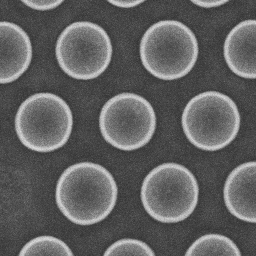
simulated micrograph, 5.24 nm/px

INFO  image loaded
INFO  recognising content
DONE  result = raised bodies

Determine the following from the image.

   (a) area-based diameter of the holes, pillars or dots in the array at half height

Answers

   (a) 0.287 microns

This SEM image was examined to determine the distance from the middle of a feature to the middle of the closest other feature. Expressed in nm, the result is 431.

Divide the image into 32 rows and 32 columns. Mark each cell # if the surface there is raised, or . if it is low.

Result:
....###........##........##.....
................................
................................
##.......###.......####.......##
###.....#####.....######.....###
####...#######....######....####
####...#######....######....####
####....######....######....####
###.....#####.....######.....###
##.......###........##..........
................................
................................
....####......####......#####...
...#####.....######....######...
..#######....######....#######..
..#######....######....#######..
..#######....######....######...
...#####......####......#####...
....###........#..........#.....
................................
...............................#
........#####......####......###
........######....######.....###
.......#######....#######...####
.......#######....#######...####
.......#######....######....####
........#####......#####.....###
.........###...................#
................................
................................
....####.......###......#####...
...######.....#####.....######..